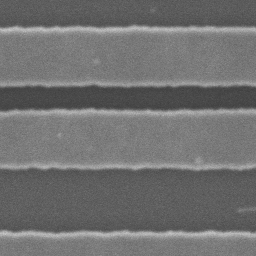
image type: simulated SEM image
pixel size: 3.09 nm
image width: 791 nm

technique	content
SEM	lines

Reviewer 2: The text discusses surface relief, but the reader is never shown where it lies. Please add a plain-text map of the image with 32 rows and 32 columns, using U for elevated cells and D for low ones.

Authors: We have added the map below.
DDDDDDDDDDDDDDDDDDDDDDDDDDDDDDDD
DDDDDDDDDDDDDDDDDDDDDDDDDDDDDDDD
DDDDDDDDDDDDDDDDDDDDDDDDDDDDDDDD
DUUDUUUUUUUUDUUUUUUUUUUUUUUUUUUU
UUUUUUUUUUUUUUUUUUUUUUUUUUUUUUUU
UUUUUUUUUUUUUUUUUUUUUUUUUUUUUUUU
UUUUUUUUUUUUUUUUUUUUUUUUUUUUUUUU
UUUUUUUUUUUUUUUUUUUUUUUUUUUUUUUU
UUUUUUUUUUUUUUUUUUUUUUUUUUUUUUUU
UUUUUUUUUUUUUUUUUUUUUUUUUUUUUUUU
UUUUUUUUUUUUUUUUUUUUUUUUUUUUUUUU
DDDDDDDDDDDDDDDDDDDDDDDDDDDDDDDD
DDDDDDDDDDDDDDDDDDDDDDDDDDDDDDDD
DDDDDDDDDDDDDDDDDDDDDDDDDDDDDDDD
UUUUUUUUUUUUUUUUUUUUUUUUUUUUUUUU
UUUUUUUUUUUUUUUUUUUUUUUUUUUUUUUU
UUUUUUUUUUUUUUUUUUUUUUUUUUUUUUUU
UUUUUUUUUUUUUUUUUUUUUUUUUUUUUUUU
UUUUUUUUUUUUUUUUUUUUUUUUUUUUUUUU
UUUUUUUUUUUUUUUUUUUUUUUUUUUUUUUU
UUUUUUUUUUUUUUUUUUUUUUUUUUUUUUUU
DDDDDDDDDDDDDDDDDDDDDDDDDDDDDDDD
DDDDDDDDDDDDDDDDDDDDDDDDDDDDDDDD
DDDDDDDDDDDDDDDDDDDDDDDDDDDDDDDD
DDDDDDDDDDDDDDDDDDDDDDDDDDDDDDDD
DDDDDDDDDDDDDDDDDDDDDDDDDDDDDDDD
DDDDDDDDDDDDDDDDDDDDDDDDDDDDDDDD
DDDDDDDDDDDDDDDDDDDDDDDDDDDDDDDD
DDDDDDDDDDDDDDDDDDDDDDDDDDDDDDDD
UUUUUUUUUUUUUUUUUUUUUUUUUUUUUUUU
UUUUUUUUUUUUUUUUUUUUUUUUUUUUUUUU
UUUUUUUUUUUUUUUUUUUUUUUUUUUUUUUU